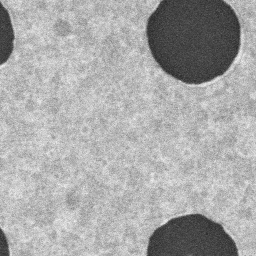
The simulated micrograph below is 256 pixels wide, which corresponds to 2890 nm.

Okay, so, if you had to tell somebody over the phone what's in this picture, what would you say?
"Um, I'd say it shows holes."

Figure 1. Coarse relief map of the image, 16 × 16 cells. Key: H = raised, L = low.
HHHHHHHHHHLLLLLH
LHHHHHHHHLLLLLLH
LHHHHHHHHLLLLLLH
LHHHHHHHHHLLLLLH
HHHHHHHHHHLLLLHH
HHHHHHHHHHHHHHHH
HHHHHHHHHHHHHHHH
HHHHHHHHHHHHHHHH
HHHHHHHHHHHHHHHH
HHHHHHHHHHHHHHHH
HHHHHHHHHHHHHHHH
HHHHHHHHHHHHHHHH
HHHHHHHHHHHHHHHH
HHHHHHHHHHHLLHHH
HHHHHHHHHHLLLLHH
LHHHHHHHHLLLLLLH